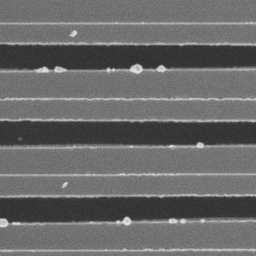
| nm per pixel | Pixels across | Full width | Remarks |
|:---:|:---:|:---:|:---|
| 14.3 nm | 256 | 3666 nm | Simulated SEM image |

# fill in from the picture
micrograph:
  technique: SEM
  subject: lines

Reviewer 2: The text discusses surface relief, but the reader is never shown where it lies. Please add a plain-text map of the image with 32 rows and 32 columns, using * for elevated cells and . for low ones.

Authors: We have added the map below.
********************************
********************************
********************************
********************************
********************************
.............*...**.***..*******
................................
................................
.....*.*........**..*...........
********************************
********************************
********************************
********************************
********************************
********************************
................................
................................
................................
.*******************************
********************************
********************************
********************************
********************************
********************************
**************.*..*.*...........
................................
................................
*..............*.....**..*....**
********************************
********************************
********************************
********************************